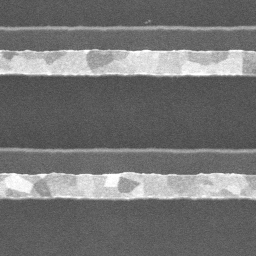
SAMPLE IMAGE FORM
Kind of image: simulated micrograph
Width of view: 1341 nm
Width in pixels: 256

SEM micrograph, lines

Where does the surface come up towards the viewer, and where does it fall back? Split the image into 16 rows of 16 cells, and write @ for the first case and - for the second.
----------------
----------------
@@@@@@@@@@@@@@@@
@@@@@@@@@@@@@@@@
@@@@@@@@@@@@@@@@
----------------
----------------
----------------
----------------
@@@@@@@@@@@@@@@@
@@@@@@@@@@@@@@@@
@@@@@@@@@@@@@@@@
----------------
----------------
----------------
----------------